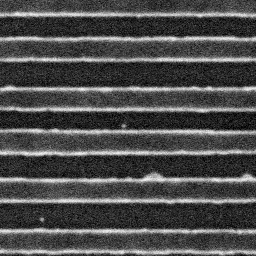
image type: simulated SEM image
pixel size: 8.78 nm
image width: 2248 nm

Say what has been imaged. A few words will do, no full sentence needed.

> lines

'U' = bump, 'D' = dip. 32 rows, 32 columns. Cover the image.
UUUUUUUUUUUUUUUUUUUUUUUUUUUUUUUU
UUUUUUUUUUUUUUUUUUUUUUUUUUUUUUUU
DDDDDDDDDDDDDDDDDDDDDDDDDDDDDDDD
DDDDDDDDDDDDDDDDDDDDDDDDDDDDDDDD
DDDDDDDDDDDDDDDDDDDDDDDDDDDDDDDD
UUUUUUUUUUUUUUUUUUUUUUUUUUUUUUUU
UUUUUUUUUUUUUUUUUUUUUUUUUUUUUUUU
UUUUUUUUUUUUUUUUUUUUUUUUUUUUUUUU
DDDDDDDDDDDDDDDDDDDDDDDDDDDDDDDD
DDDDDDDDDDDDDDDDDDDDDDDDDDDDDDDD
DDDDDDDDDDDDDDDDDDDDDDDDDDDDDDDD
UUUUUUUUUUUUUUUUUUUUUUUUUUUUUUUU
UUUUUUUUUUUUUUUUUUUUUUUUUUUUUUUU
UUUUUUUUUUUUUUUUUUUUUUUUUUUUUUUU
DDDDDDDDDDDDDDDDDDDDDDDDDDDDDDDD
DDDDDDDDDDDDDDDDDDDDDDDDDDDDDDDD
UUUUUUUUUUUUUUUUUUUUUUUUUUUUUUUU
UUUUUUUUUUUUUUUUUUUUUUUUUUUUUUUU
UUUUUUUUUUUUUUUUUUUUUUUUUUUUUUUU
DDDDDDDDDDDDDDDDDDDDDDDDDDDDDDDD
DDDDDDDDDDDDDDDDDDDDDDDDDDDDDDDD
DDDDDDDDDDDDDDDDDDDDDDDDDDDDDDDD
UUUUUUUUUUUUUUUUUUUUUUUUUUUUUUUU
UUUUUUUUUUUUUUUUUUUUUUUUUUUUUUUU
UUUUUUUUUUUUUUUUUUUUUUUUUUUUUUUU
DDDDDDDDDDDDDDDDDDDDDDDDDDDDDDDD
DDDDDDDDDDDDDDDDDDDDDDDDDDDDDDDD
DDDDDDDDDDDDDDDDDDDDDDDDDDDDDDDD
DDDDDDDDDDDDDDDDDDDDDDDDDDDDDDDD
UUUUUUUUUUUUUUUUUUUUUUUUUUUUUUUU
UUUUUUUUUUUUUUUUUUUUUUUUUUUUUUUU
UUUUUUUUUUUUUUUUUUUUUUUUUUUUUUUU